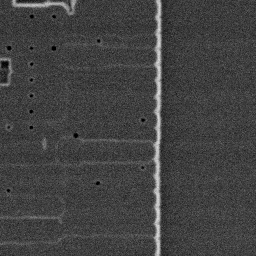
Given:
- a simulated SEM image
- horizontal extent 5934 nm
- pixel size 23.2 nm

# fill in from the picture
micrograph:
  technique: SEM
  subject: wiring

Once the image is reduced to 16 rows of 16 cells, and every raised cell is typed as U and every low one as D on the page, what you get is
UUUUUUUUUUDDDDDD
UUUUUUUUUUDDDDDD
UUUUUUUUUUDDDDDD
UUUUUUUUUUDDDDDD
DUUUUUUUUUDDDDDD
UUUUUUUUUUDDDDDD
UUUUUUUUUUDDDDDD
UUUUUUUUUUDDDDDD
UUUUUUUUUUDDDDDD
UUUUUUUUUUDDDDDD
UUUUUUUUUUDDDDDD
UUUUUUUUUUDDDDDD
UUUUUUUUUUDDDDDD
UUUUUUUUUUDDDDDD
UUUUUUUUUUDDDDDD
UUUUUUUUUUDDDDDD